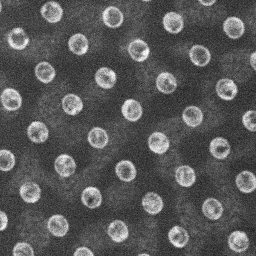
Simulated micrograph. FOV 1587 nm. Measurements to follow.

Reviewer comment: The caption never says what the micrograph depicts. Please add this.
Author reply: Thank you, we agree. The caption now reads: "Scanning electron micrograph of a regular array of raised bodies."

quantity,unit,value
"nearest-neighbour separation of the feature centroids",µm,0.261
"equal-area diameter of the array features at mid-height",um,0.116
